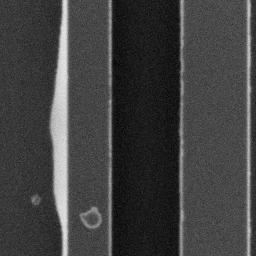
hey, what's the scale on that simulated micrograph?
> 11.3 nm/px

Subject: lines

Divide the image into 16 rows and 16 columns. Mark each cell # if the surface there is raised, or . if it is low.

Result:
....###....#####
....###....#####
....###....#####
....###....#####
....###....#####
....###....#####
....###....#####
....###....#####
....###....#####
....###....#####
....###....#####
....###....#####
....###....#####
....###....#####
....###....#####
....###....#####